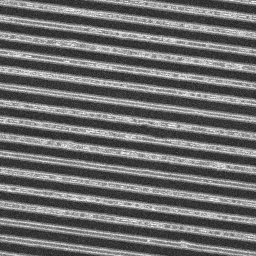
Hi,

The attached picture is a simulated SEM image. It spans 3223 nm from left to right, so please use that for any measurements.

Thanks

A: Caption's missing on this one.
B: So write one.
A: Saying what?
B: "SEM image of parallel lines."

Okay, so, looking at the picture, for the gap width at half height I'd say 131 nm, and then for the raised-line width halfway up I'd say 78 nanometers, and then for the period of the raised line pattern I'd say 16.7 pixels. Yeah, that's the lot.